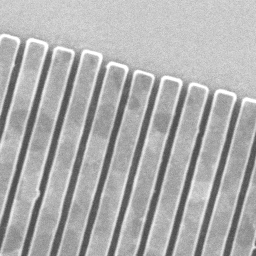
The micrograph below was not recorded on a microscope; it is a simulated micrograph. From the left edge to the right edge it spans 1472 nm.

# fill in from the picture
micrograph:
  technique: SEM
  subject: parallel lines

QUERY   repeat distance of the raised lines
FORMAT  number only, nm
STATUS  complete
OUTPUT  160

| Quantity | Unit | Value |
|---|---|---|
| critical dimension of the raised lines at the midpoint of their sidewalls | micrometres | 0.108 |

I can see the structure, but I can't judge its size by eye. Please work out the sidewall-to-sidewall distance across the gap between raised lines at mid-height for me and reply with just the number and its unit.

51.4 nm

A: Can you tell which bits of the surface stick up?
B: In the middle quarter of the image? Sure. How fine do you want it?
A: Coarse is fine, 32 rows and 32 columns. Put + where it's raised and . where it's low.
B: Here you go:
++..+++++..+++..................
+...++++...+++++................
+..+++++...+++++..+++...........
+..+++++..+++++..+++++...++.....
...+++++..+++++..+++++...++++...
...++++...+++++..+++++..+++++...
..+++++..+++++...+++++..+++++..+
..+++++..+++++...++++...+++++..+
..+++++..+++++..+++++..+++++...+
.+++++...+++++..+++++..+++++..++
.+++++..+++++...+++++..+++++..++
.+++++..+++++..+++++...++++...++
.++++...+++++..+++++..+++++...++
+++++...+++++..+++++..+++++..+++
+++++..+++++..++++++..+++++..+++
+++++..+++++..+++++...++++...+++
+++++..+++++..+++++..+++++...+++
++++..++++++..+++++..+++++..++++
++++..+++++..+++++...+++++..++++
++++..+++++..+++++...++++...++++
+++...+++++..+++++..+++++..+++++
+++..+++++...+++++..+++++..+++++
+++..+++++...++++...++++...+++++
+++..+++++..+++++..+++++...++++.
++...+++++..+++++..+++++..+++++.
++...++++...++++...+++++..+++++.
++..+++++...++++...++++...+++++.
+...+++++..+++++..+++++...++++..
+...+++++..+++++..+++++..+++++..
+...++++..++++++..+++++..+++++..
+..+++++..+++++...++++...+++++..
...+++++..+++++..+++++..+++++...